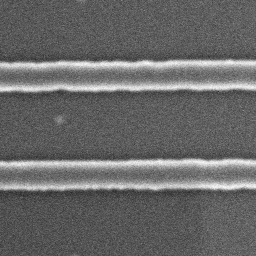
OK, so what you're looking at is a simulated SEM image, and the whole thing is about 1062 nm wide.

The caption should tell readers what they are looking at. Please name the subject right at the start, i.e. lines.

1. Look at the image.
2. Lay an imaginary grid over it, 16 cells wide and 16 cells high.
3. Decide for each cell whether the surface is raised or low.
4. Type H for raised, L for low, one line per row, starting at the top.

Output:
LLLLLLLLLLLLLLLL
LLLLLLLLLLLLLLLL
LLLLLLLLLLLLLLLL
LLLLLLLLLLLLLLLL
HHHHHHHHHHHHHHHH
HHHHHHHHHHHHHHHH
LLLLLLLLLLLLLLLL
LLLLLLLLLLLLLLLL
LLLLLLLLLLLLLLLL
LLLLLLLLLLLLLLLL
HHHHHHHHHHHHHHHH
HHHHHHHHHHHHHHHH
LLLLLLLLLLLLLLLL
LLLLLLLLLLLLLLLL
LLLLLLLLLLLLLLLL
LLLLLLLLLLLLLLLL